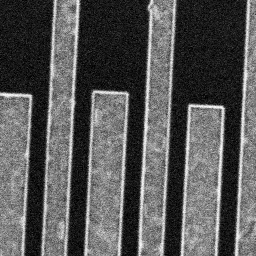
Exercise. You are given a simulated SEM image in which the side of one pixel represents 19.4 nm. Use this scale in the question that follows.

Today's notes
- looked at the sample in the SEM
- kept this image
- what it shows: parallel lines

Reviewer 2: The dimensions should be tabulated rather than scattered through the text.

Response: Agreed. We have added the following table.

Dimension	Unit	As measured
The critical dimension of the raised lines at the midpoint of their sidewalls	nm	407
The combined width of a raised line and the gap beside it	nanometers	938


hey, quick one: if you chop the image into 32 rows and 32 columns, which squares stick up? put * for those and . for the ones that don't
*******...*********...*********.
*******...*********...*********.
*******...*********...*********.
*******...*********...*********.
*******..**********...*********.
*******..**********...*********.
*******..**********...*********.
*******..**********..**********.
******...**********..**********.
******...**********..**********.
******...*********...**********.
******...*********...**********.
....**...***....**...**********.
....**...***....**...***...***..
....**...***....**...***....**..
....**...**.....**...***....**..
....**...**.....**...***....**..
....**...**.....**...***....**..
....**...**.....**...**.....**..
...***...**....***...**.....**..
...***...**....***...**.....**..
...***...**....***...**.....**..
...***...**....***...**....***..
...***...**....***...**....***..
...***..***....***...**....***..
...***..***....***...**....***..
...***..***....***...**....***..
...***..***....***..***....***..
...***..***....***..***....***..
...**...***....***..***....***..
...**...***....**...***....***..
...**...***....**...***....***..